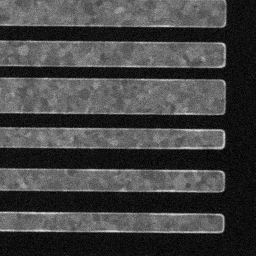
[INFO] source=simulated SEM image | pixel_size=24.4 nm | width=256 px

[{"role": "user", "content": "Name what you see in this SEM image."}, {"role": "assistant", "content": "groups of lines, slits or small figures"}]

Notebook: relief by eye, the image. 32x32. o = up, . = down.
oooooooooooooooooooooooooooo....
oooooooooooooooooooooooooooo....
oooooooooooooooooooooooooooo....
................................
................................
oooooooooooooooooooooooooooo....
oooooooooooooooooooooooooooo....
oooooooooooooooooooooooooooo....
................................
................................
oooooooooooooooooooooooooooo....
oooooooooooooooooooooooooooo....
oooooooooooooooooooooooooooo....
oooooooooooooooooooooooooooo....
................................
................................
oooooooooooooooooooooooooooo....
oooooooooooooooooooooooooooo....
..............ooooooooo...oo....
................................
................................
oooooooooooooooooooooooooooo....
oooooooooooooooooooooooooooo....
oooooooooooooooooooooooooooo....
................................
................................
................................
oooooooooooooooooooooooooooo....
oooooooooooooooooooooooooooo....
................................
................................
................................